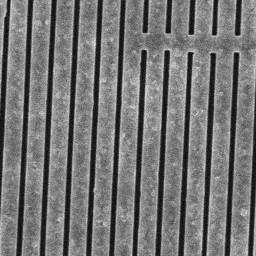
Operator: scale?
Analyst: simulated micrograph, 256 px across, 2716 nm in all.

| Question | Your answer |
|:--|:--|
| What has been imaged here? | parallel lines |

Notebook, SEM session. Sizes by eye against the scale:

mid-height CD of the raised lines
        0.188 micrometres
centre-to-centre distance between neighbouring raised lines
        245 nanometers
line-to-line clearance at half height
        57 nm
